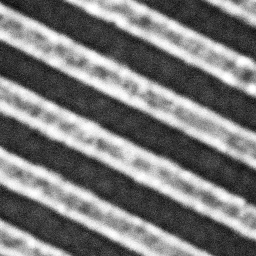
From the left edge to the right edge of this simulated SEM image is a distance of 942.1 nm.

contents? one or a few lines or trenches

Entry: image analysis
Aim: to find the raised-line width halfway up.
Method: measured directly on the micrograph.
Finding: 79.6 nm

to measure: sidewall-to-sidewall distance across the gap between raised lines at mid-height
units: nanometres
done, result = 156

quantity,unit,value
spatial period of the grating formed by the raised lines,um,0.235